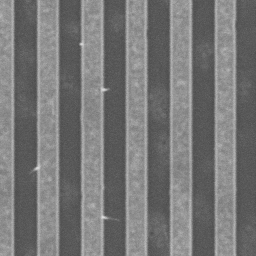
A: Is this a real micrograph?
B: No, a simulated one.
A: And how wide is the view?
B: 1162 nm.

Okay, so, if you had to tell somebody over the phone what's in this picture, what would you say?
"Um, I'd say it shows parallel lines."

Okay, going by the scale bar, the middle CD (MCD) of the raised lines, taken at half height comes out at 86.9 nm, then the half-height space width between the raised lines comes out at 0.112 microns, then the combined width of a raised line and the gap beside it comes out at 201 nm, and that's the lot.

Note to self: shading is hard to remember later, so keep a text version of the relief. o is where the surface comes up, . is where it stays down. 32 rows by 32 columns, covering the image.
oo...oo...ooo...oo...ooo...oo...
oo...oo...ooo...oo...ooo...oo...
oo...oo...ooo...oo...ooo...oo...
oo...oo...ooo...oo...ooo...oo...
o....oo...ooo...oo...ooo...oo...
oo...oo...ooo...oo...ooo...oo...
oo...oo...ooo...oo...ooo...oo...
oo...oo...ooo...oo...ooo...oo...
oo...oo...ooo...oo...ooo...oo...
o....oo...ooo...oo...ooo...oo...
oo...oo...ooo...oo....oo...oo...
oo...oo...ooo...oo....oo...oo...
oo...oo...ooo...oo....oo...oo...
oo...oo...ooo...oo...ooo...oo...
oo...oo...ooo...oo...ooo...oo...
oo...oo...ooo...oo...ooo...oo...
oo...oo...ooo...oo...ooo...oo...
oo...oo...ooo...oo...ooo...oo...
oo...oo...ooo...oo...ooo...oo...
oo...oo...ooo...oo...ooo...oo...
oo...oo...ooo...oo...ooo...oo...
oo...oo...ooo...oo...ooo...oo...
oo...oo...ooo...oo...ooo...oo...
oo...oo...ooo...oo...ooo...oo...
oo...oo...ooo...oo...ooo...oo...
oo...oo...ooo...oo...ooo...oo...
oo...oo...ooo...oo...ooo...oo...
oo...oo...ooo...oo...ooo...oo...
oo...oo...ooo...oo...ooo...oo...
oo...oo...ooo...oo...ooo...oo...
oo...oo...ooo...oo...ooo...oo...
oo...oo...ooo...oo...ooo...oo...